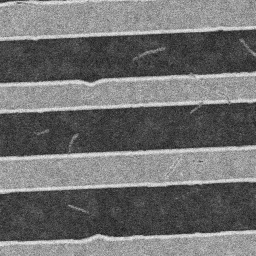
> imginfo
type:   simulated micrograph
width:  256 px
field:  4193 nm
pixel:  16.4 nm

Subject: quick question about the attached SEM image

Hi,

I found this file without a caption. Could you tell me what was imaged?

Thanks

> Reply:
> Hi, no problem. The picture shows one or a few lines or trenches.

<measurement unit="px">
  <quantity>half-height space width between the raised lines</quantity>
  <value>48.3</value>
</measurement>